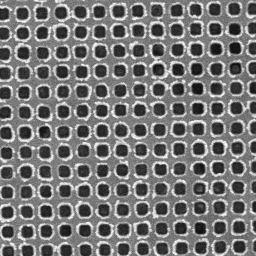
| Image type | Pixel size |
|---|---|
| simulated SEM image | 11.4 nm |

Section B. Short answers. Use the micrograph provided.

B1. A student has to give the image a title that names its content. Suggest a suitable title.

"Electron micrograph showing a regular array of holes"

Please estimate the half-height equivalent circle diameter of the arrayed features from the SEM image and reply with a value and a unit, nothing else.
145 nanometers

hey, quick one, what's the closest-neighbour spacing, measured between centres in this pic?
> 217 nanometers